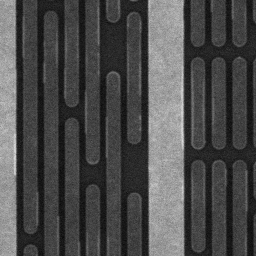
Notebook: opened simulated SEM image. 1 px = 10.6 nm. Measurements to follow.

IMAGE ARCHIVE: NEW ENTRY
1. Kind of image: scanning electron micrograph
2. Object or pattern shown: groups of lines, slits or small figures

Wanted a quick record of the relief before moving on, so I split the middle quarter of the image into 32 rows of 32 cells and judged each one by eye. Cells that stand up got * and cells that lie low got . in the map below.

***...***.......***..*********..
***...***.......***..*********..
***...***..**...***..*********..
***...***..***..***..********...
***...***..***..***..********...
***...***..***..***..********...
***...***..***..***..********...
***...***..***..***..********...
***...***..***..***..********...
***...***..***..***..********...
..*...***..***..***..********...
......***..***..***..********...
......***..***..***..********...
......***..***..***..********...
.**...***..***..***..********...
***...***..***..***..********...
***...***..***..***..********...
***...***..***..***..********...
***...***..***..***..********...
****..***..***..***..*********..
****..***..***.......*********..
****..***..***.......*********..
****..***..***.......*********..
***...***..***.......*********..
***...**...***.......*********..
***........***.......*********..
***........***.......*********..
****.......***.......*********..
****.......***.......*********..
****.......***.......*********..
****..**...***.......*********..
****..***..***.......*********..